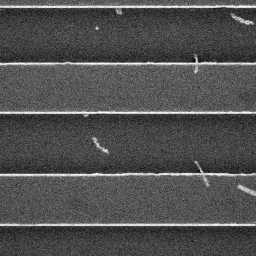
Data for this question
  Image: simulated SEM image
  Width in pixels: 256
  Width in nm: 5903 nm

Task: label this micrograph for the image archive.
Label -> lines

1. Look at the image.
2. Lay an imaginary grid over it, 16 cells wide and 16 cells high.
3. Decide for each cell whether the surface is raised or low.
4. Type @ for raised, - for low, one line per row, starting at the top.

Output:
----------------
----------------
----------------
----------------
@@@@@@@@@@@@@@@@
@@@@@@@@@@@@@@@@
@@@@@@@@@@@@@@@@
----------------
----------------
----------------
----------------
@@@@@@@@@@@@@@@@
@@@@@@@@@@@@@@@@
@@@@@@@@@@@@@@@@
----------------
----------------